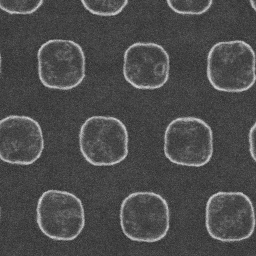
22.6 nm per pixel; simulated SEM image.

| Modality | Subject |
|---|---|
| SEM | a regular array of raised bodies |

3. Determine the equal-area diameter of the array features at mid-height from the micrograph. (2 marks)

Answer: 1100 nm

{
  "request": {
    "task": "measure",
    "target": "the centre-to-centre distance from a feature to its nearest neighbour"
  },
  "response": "1920 nanometers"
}